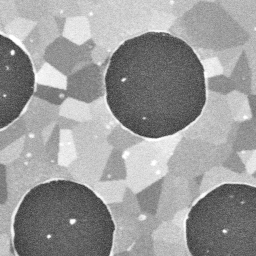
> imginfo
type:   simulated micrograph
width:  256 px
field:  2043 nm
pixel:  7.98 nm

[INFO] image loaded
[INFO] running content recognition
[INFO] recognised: holes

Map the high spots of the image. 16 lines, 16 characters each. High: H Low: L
HHHHHHHHHHHHHHHH
HHHHHHHHHHHHHHHH
LHHHHHHHLLLHHHHH
LLHHHHHLLLLLHHHH
LLHHHHHLLLLLLHHH
LLHHHHHLLLLLLHHH
LLHHHHHLLLLLLHHH
LHHHHHHLLLLLHHHH
HHHHHHHHHLHHHHHH
HHHHHHHHHHHHHHHH
HHHHHHHHHHHHHHHH
HHHLLHHHHHHHHHLH
HLLLLLHHHHHHLLLL
HLLLLLLHHHHHLLLL
HLLLLLLHHHHHLLLL
HLLLLLLHHHHHLLLL